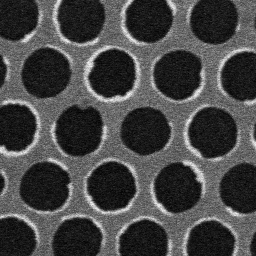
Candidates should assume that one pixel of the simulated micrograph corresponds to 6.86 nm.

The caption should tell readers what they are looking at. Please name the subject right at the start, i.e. a regular array of holes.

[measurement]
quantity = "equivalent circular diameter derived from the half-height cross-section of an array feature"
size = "0.344 um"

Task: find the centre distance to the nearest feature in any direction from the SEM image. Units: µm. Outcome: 0.446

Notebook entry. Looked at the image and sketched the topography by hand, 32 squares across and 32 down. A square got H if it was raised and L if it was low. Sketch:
LLLLLHHLLLLLLHHHLLLLLHHHLLLLLHHH
LLLLLHHLLLLLLHHHLLLLLHHHLLLLLLHH
LLLLLHHLLLLLLHHHLLLLLLHHLLLLLLHH
LLLLHHHLLLLLLHHHLLLLLHHHLLLLLLHH
LLLHHHHHLLLLHHHHLLLLLHHHLLLLLHHH
HHHHHHHHHHHHHHHHHHHHHHHHHHLLHHHH
HHHHLLLLHHHHHLLLHHHHHLLLHHHHHHLH
HHHLLLLLHHHHLLLLLHHHLLLLLHHHLLLL
LHHLLLLLLHHLLLLLLHHLLLLLLHHHLLLL
LHHLLLLLLHHLLLLLLHHLLLLLLHHHLLLL
HHHLLLLLLHHLLLLLLHHLLLLLLHHHLLLL
HHHLLLLLHHHHLLLLHHHHLLLLHHHHLLLL
HHHHHHHHHHHHHHHHHHHHHHLHHHHHHLLL
LLLLHHHHLLHLHHHHHLLHHHHHHLLHHHHH
LLLLHHHLLLLLLHHHLLLLLHHHLLLLLHHH
LLLLLHHLLLLLLHHLLLLLLHHHLLLLLLHH
LLLLHHHLLLLLLHHLLLLLLHHLLLLLLLHH
LLLLHHHLLLLLLHHLLLLLLHHHLLLLLLHH
LLLHHHHHLLLLHHHHLLLLHHHHLLLLLHHH
HHHHHHHHHLLHHHHHHHHHHHHHHLLLHHHH
HHHHLLLHHHHHHLLHHHHHHLLHHHHHHHLH
HHHLLLLLHHHHLLLLHHHHLLLLHHHHLLLL
LHHLLLLLLHHLLLLLLHHLLLLLLHHHLLLL
LHLLLLLLLHHLLLLLLHHLLLLLLHHLLLLL
HHLLLLLLLHHLLLLLLHHLLLLLLHHLLLLL
HHHLLLLLHHHHLLLLHHHHLLLLLHHHLLLL
HHHHHHHHHHHHHHHHHHHHHLLHHHHHHLLL
LLLHHHHHLLLHHHHHHLLHHHHHHHHHHHHH
LLLLHHHLLLLLHHHHLLLLHHHHLLLLHHHH
LLLLHHHLLLLLLHHLLLLLLHHHLLLLLHHH
LLLLHHLLLLLLLHHLLLLLLHHLLLLLLHHL
LLLLHHHLLLLLHHHLLLLLLHHLLLLLLHHL